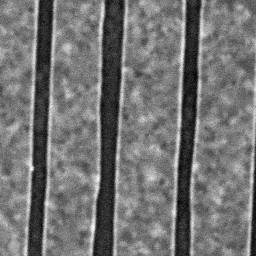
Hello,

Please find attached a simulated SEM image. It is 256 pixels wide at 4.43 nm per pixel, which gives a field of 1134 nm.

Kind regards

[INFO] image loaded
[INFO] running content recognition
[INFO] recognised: one or a few lines or trenches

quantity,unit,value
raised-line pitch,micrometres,0.335